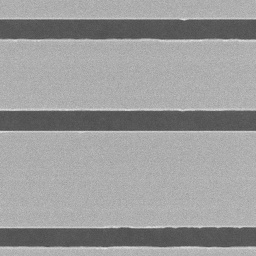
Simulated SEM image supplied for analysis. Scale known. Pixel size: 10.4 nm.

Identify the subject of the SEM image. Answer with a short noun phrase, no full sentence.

lines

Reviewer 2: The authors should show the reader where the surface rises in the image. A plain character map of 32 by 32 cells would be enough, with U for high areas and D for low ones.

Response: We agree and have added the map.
UUUUUUUUUUUUUUUUUUUUUUUUUUUUUUUU
UUUUUUUUUUUUUUUUUUUUUUUUUUUUUUUU
DDDDDDDDDDDDDDDDDDDDDDDDDDDDDDDD
DDDDDDDDDDDDDDDDDDDDDDDDDDDDDDDD
DDDDDDDDDDDDDDDDDDDDDDDDDDDDDDDD
UUUUUUUUUUUUUUUUUUUUUUUUUUUUUUUU
UUUUUUUUUUUUUUUUUUUUUUUUUUUUUUUU
UUUUUUUUUUUUUUUUUUUUUUUUUUUUUUUU
UUUUUUUUUUUUUUUUUUUUUUUUUUUUUUUU
UUUUUUUUUUUUUUUUUUUUUUUUUUUUUUUU
UUUUUUUUUUUUUUUUUUUUUUUUUUUUUUUU
UUUUUUUUUUUUUUUUUUUUUUUUUUUUUUUU
UUUUUUUUUUUUUUUUUUUUUUUUUUUUUUUU
UUUUUUUUUUUUUUUUUUUUUUUUUUUUUUUU
DDDDDDDDDDDDDDDDDDDDDDDDDDDDDDDD
DDDDDDDDDDDDDDDDDDDDDDDDDDDDDDDD
UUUUUUUUUUUUUUUUUUUUUUUUUUUUUUUU
UUUUUUUUUUUUUUUUUUUUUUUUUUUUUUUU
UUUUUUUUUUUUUUUUUUUUUUUUUUUUUUUU
UUUUUUUUUUUUUUUUUUUUUUUUUUUUUUUU
UUUUUUUUUUUUUUUUUUUUUUUUUUUUUUUU
UUUUUUUUUUUUUUUUUUUUUUUUUUUUUUUU
UUUUUUUUUUUUUUUUUUUUUUUUUUUUUUUU
UUUUUUUUUUUUUUUUUUUUUUUUUUUUUUUU
UUUUUUUUUUUUUUUUUUUUUUUUUUUUUUUU
UUUUUUUUUUUUUUUUUUUUUUUUUUUUUUUU
UUUUUUUUUUUUUUUUUUUUUUUUUUUUUUUU
UUUUUUUUUUUUUUUUUUUUUUUUUUUUUUUU
DDDDDDDDDDDDDDDDDDDDDDDDDDDDDDDD
DDDDDDDDDDDDDDDDDDDDDDDDDDDDDDDD
DDDDDDDDDDDDDDDDDDDDDDDDDDDDDDDD
UUUUUUUUUUUUUUUUUUUUUUUUUUUUUUUU